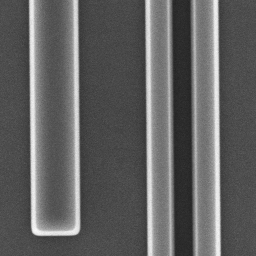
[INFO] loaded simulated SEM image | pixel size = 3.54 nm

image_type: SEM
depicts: groups of lines, slits or small figures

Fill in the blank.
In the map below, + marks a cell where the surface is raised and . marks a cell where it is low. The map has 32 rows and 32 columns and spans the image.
....+++++.........+++...+++.....
....+++++.........+++...+++.....
....+++++..........++...+++.....
....+++++..........++...+++.....
....+++++..........++...+++.....
....++++++.........++...+++.....
....++++++.........++...+++.....
....++++++.........++...+++.....
....++++++.........++...+++.....
....++++++.........++...+++.....
....++++++.........++...+++.....
....++++++.........++...+++.....
....++++++.........++...+++.....
....++++++.........++...+++.....
....++++++.........++...+++.....
....++++++.........++...+++.....
....++++++.........++...+++.....
....++++++.........++...+++.....
....++++++.........++...+++.....
....++++++.........++...+++.....
....++++++.........++...+++.....
....++++++.........++...+++.....
....++++++.........++...+++.....
....++++++.........++...+++.....
....++++++.........++...+++.....
....++++++.........++...+++.....
....++++++.........++...+++.....
....++++++.........++...+++.....
....++++++.........+++..+++.....
...................+++..+++.....
...................+++..+++.....
...................+++..+++.....